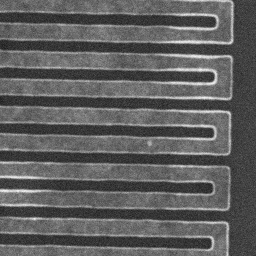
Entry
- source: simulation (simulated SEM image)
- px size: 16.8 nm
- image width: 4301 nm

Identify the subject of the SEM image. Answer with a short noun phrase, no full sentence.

groups of lines, slits or small figures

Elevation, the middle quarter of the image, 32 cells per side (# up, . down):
################################
................................
................................
................................
##################..............
################################
################################
################################
................................
................................
................................
################..####..........
################################
################################
################################
................................
................................
................................
###################....##.......
################################
################################
################################
................................
................................
................................
########################........
################################
################################
################################
................................
................................
................................